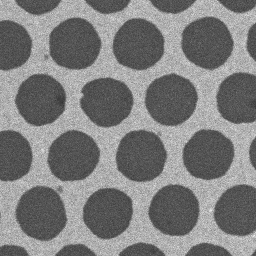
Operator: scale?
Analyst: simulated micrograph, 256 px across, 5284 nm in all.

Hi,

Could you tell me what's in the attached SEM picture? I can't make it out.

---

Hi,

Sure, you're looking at a regular array of holes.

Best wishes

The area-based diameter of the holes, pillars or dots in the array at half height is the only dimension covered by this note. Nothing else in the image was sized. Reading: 1.07 microns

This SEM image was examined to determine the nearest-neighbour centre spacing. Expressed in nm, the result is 1320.